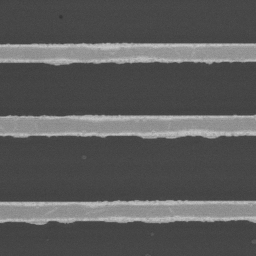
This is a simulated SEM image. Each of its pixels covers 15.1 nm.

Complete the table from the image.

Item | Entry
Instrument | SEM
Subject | lines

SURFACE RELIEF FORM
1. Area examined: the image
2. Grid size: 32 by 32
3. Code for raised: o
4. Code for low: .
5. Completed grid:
................................
................................
................................
................................
................................
................................
oooooooooooooooooooooooooooooooo
oooooooooooooooooooooooooooooooo
................................
................................
................................
................................
................................
................................
...............................o
oooooooooooooooooooooooooooooooo
oooooooooooooooooooooooooooooooo
................................
................................
................................
................................
................................
................................
................................
................................
oooooooooooooooooooooooooooooooo
oooooooooooooooooooooooooooooooo
ooooooooooooo.....o.............
................................
................................
................................
................................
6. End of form